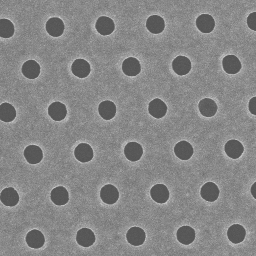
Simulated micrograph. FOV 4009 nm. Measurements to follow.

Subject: a regular array of holes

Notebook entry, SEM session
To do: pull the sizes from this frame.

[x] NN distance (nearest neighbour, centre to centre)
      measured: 0.765 microns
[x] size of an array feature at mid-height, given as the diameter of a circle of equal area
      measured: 303 nm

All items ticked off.